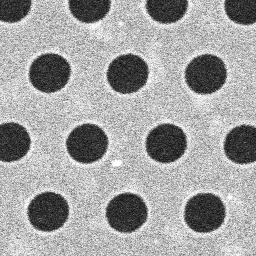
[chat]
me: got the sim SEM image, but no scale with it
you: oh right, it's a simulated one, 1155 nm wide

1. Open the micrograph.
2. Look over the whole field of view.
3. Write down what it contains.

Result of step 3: a regular array of holes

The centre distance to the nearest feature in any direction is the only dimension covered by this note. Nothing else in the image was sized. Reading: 353 nanometers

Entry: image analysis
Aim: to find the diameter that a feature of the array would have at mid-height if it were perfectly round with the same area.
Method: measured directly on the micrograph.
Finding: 190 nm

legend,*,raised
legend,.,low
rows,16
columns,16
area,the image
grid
..**...**...**..
***************.
****************
**..***..***.***
**..***..***..**
**..***..***..**
****************
****************
..**...**...**..
..**...**...**..
****************
****************
**..***..***..**
**..***..***..**
************.***
****************